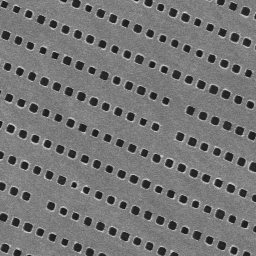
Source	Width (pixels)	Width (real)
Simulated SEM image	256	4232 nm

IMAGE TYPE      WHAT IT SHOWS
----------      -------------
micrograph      a regular array of holes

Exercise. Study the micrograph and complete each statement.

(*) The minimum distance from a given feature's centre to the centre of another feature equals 0.217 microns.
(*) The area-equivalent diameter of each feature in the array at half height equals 140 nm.